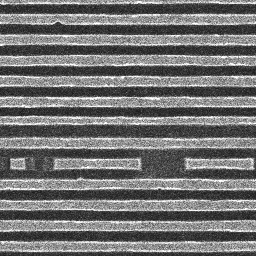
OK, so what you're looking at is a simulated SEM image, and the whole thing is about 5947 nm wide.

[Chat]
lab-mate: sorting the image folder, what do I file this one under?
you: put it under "parallel lines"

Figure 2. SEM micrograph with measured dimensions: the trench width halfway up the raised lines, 212 nm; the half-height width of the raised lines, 253 nanometres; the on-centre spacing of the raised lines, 480 nm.